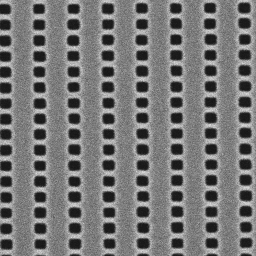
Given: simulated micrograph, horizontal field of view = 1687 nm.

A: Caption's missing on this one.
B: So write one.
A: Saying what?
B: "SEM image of a regular array of holes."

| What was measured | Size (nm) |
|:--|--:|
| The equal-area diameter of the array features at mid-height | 81.5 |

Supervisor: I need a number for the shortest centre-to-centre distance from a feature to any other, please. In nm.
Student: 102